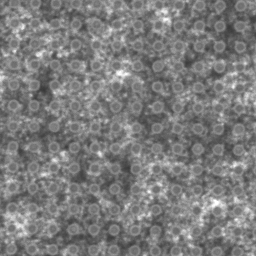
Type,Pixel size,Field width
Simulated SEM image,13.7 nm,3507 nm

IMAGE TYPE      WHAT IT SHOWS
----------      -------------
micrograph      a regular array of raised bodies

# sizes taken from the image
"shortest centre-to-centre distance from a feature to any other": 274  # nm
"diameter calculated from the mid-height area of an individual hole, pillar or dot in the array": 0.142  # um